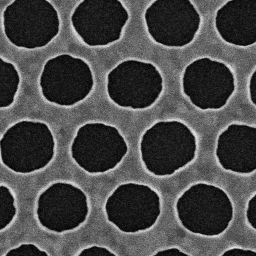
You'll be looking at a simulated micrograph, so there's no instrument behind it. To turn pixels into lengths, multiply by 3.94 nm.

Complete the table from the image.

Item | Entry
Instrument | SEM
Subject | a regular array of holes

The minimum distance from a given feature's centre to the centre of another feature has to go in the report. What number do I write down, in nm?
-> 272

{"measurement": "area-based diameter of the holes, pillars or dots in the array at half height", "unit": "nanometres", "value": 205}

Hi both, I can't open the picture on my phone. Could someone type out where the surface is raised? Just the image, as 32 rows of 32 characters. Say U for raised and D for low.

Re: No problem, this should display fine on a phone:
UDDDDDUUUUDDDDDUUUUDDDDDUUUUDDDD
UDDDDDDUUDDDDDDDUUDDDDDDDUUDDDDD
DDDDDDDUUDDDDDDDUUDDDDDDDUUDDDDD
UDDDDDDUUDDDDDDUUUDDDDDDDUUDDDDD
UDDDDDDUUUDDDDDUUUUDDDDDUUUUDDDD
UUDDDDUUUUUDDDUUUUUUDDDUUUUUUDDU
UUUUUUUUUUUUUUUUUUUUUUUUUUUUUUUU
UUUUUUDDDDUUUUUUDUUUUUUUUDDUUUUU
DDUUUDDDDDDUUUDDDDDDUUUDDDDDDUUU
DDUUUDDDDDDDUUDDDDDDUUUDDDDDDUUD
DDUUUDDDDDDDUDDDDDDDUUUDDDDDDUUD
DDUUUDDDDDDUUUDDDDDDUUUDDDDDDUUD
DDUUUUDDDDUUUUDDDDDUUUUUDDDDUUUD
UUUUUUUUUUUUUUUUDDUUUUUUUDDDUUUU
UUUUUUUUUUUUUUUUUUUUUUUUUUUUUUUU
UUDDDDUUUUUDDUUUUUUDDDDUUUUUUDUU
UDDDDDUUUUDDDDDUUUDDDDDDUUUUDDDD
DDDDDDDUUDDDDDDUUUDDDDDDUUUDDDDD
DDDDDDDUUDDDDDDDUUDDDDDDUUUDDDDD
DDDDDDDUUDDDDDDUUUDDDDDDUUUDDDDD
UDDDDDUUUUDDDDDUUUDDDDDUUUUUDDDD
UUDDUUUUUUUDDUUUUUUDDDUUUUUUUUDU
UUUUUUUUUUUUUUUUUUUUUUUUUUUUUUUU
DUUUUUDDDDUUUUUDDDDUUUUUDDDUUUUU
DDUUUDDDDDDUUUDDDDDDUUUDDDDDUUUU
DDUUUDDDDDDUUDDDDDDDUUDDDDDDDUUD
DDUUUDDDDDDUUDDDDDDDUUDDDDDDDUUD
DUUUUDDDDDDUUUDDDDDDUUDDDDDDDUUD
UUUUUUDDDDUUUUUDDDUUUUUDDDDDUUUU
UUUUUUUUUUUUUUUUUUUUUUUUUUUUUUUU
UUUDUUUUUUUUUUUUUUUUUUUUUUUUUUUU
UDDDDUUUUUDDDDUUUUUUDDDUUUUUDDDD